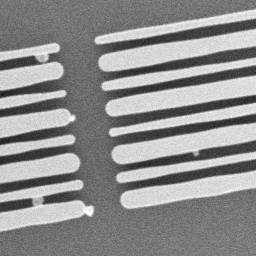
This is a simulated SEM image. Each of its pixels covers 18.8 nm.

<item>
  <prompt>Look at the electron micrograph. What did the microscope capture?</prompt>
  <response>groups of lines, slits or small figures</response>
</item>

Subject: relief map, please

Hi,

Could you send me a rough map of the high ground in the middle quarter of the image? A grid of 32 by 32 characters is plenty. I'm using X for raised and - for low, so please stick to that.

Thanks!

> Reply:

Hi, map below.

---------XXXXXXXXXXX------------
----------XXX---------------XXXX
---------------------XXXXXXXXXXX
---------------XXXXXXXXXXXXXX---
-----------XXXXXXXXXXXXX--------
----------XXXXXXXXX-------------
--------------------------XXXXXX
--------------------XXXXXXXXXXXX
---------------XXXXXXXXXXXXXXXXX
-----------XXXXXXXXXXXXXXXXXXXXX
-----------XXXXXXXXXXXXXXXXXXX--
X----------XXXXXXXXXXX----------
X----------XXXX-----------------
X--------------------------XXXXX
X---------------------XXXXXXXXXX
-----------------XXXXXXXXXXX----
------------XXXXXXXXX-----------
------------XX-----------------X
XXX-----------------------XXXXXX
XX------------------XXXXXXXXXXXX
--------------XXXXXXXXXXXXXXXXXX
------------XXXXXXXXXXXXXXXXXXXX
XX----------XXXXXXXXXXXXXXXX----
XXX---------XXXXXXXXXXX---------
XXXX---------XXXXX--------------
XXXX---------------------XXXXXXX
XXX---------------XXXXXXXXXXXXXX
--------------XXXXXXXXXXXX------
-------------XXXXXXXX-----------
--XX----------X----------------X
XXXX--------------------XXXXXXXX
XXX---------------XXXXXXXXXXXXXX